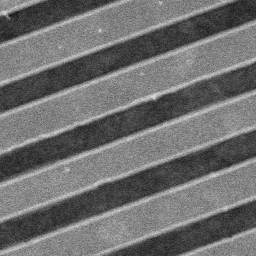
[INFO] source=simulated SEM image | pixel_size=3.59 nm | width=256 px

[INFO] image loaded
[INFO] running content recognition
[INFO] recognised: one or a few lines or trenches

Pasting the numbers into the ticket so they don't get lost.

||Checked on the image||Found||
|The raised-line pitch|0.232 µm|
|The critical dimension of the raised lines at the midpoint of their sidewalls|130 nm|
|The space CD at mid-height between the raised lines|102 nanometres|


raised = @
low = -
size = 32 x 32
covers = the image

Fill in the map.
@@@@----------@@@@@@@@@@@@@@----
@----------@@@@@@@@@@@@@@-------
--------@@@@@@@@@@@@@@----------
------@@@@@@@@@@@@@----------@@@
---@@@@@@@@@@@@@@----------@@@@@
@@@@@@@@@@@@@@----------@@@@@@@@
@@@@@@@@@@@----------@@@@@@@@@@@
@@@@@@@@@----------@@@@@@@@@@@@@
@@@@@@----------@@@@@@@@@@@@@---
@@@----------@@@@@@@@@@@@@@-----
----------@@@@@@@@@@@@@@--------
--------@@@@@@@@@@@@@----------@
-----@@@@@@@@@@@@@-----------@@@
--@@@@@@@@@@@@@@----------@@@@@@
@@@@@@@@@@@@@----------@@@@@@@@@
@@@@@@@@@@----------@@@@@@@@@@@@
@@@@@@@@----------@@@@@@@@@@@@@-
@@@@-----------@@@@@@@@@@@@@----
@@----------@@@@@@@@@@@@@-------
----------@@@@@@@@@@@@----------
-------@@@@@@@@@@@@@----------@@
----@@@@@@@@@@@@@----------@@@@@
-@@@@@@@@@@@@@-----------@@@@@@@
@@@@@@@@@@@-----------@@@@@@@@@@
@@@@@@@@@----------@@@@@@@@@@@@@
@@@@@@----------@@@@@@@@@@@@@@--
@@@-----------@@@@@@@@@@@@@-----
-----------@@@@@@@@@@@@@@-------
--------@@@@@@@@@@@@@@----------
------@@@@@@@@@@@@@----------@@@
---@@@@@@@@@@@@@----------@@@@@@
@@@@@@@@@@@@@-----------@@@@@@@@